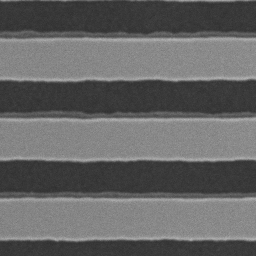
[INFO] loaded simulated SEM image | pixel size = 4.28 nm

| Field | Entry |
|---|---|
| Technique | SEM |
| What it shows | lines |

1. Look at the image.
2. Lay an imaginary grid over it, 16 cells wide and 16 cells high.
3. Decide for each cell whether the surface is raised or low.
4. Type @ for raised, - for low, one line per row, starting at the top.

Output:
----------------
----------------
@@@@@@@@@@@@@@@@
@@@@@@@@@@@@@@@@
@@@@@@@@@@@@@@@@
----------------
----------------
@@@@@@@@@@@@@@@@
@@@@@@@@@@@@@@@@
@@@@@@@@@@@@@@@@
----------------
----------------
@@@@@@@@@@@@@@@@
@@@@@@@@@@@@@@@@
@@@@@@@@@@@@@@@@
----------------